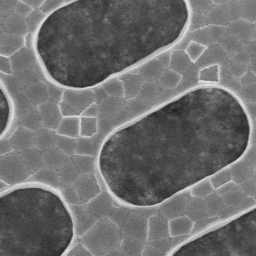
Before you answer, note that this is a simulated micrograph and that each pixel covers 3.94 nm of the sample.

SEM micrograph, holes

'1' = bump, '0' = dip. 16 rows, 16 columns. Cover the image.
1111000000001111
1110000000001111
1100000000011111
1100000000111111
1110000111111111
1111111111110011
0111111111000001
0111111100000001
1111111000000000
1111110000000001
1111110000000011
1111111000001111
0000111100111111
0000111111111110
0000011111111000
0000111111100000